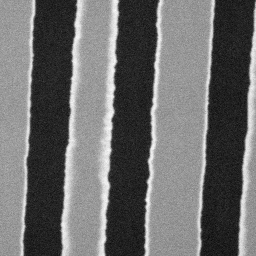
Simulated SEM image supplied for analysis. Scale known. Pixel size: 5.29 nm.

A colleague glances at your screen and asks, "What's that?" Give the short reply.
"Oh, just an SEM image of lines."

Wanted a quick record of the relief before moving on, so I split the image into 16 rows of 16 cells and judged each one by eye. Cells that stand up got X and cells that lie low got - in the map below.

XX---XX---XXX---
XX---XX---XXX---
XX---XX---XXX---
XX---XX---XXX---
XX---XX---XXX---
XX---XX---XXX---
XX--XXX---XXX---
XX--XXX--XXXX---
XX--XXX---XXX--X
XX--XXX--XXXX--X
XX--XXX--XXXX--X
XX--XXX--XXXX--X
XX--XXX--XXXX--X
XX--XXX--XXXX--X
X---XXX--XXXX--X
X---XX---XXX---X